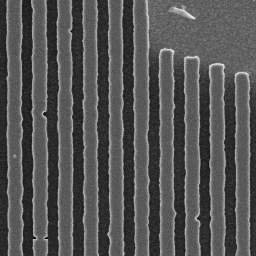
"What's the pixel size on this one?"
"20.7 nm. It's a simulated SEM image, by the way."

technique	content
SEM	parallel lines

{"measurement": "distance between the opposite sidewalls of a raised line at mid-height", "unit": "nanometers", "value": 303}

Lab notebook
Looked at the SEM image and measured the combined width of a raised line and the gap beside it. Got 524 nanometres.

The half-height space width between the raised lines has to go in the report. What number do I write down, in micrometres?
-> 0.233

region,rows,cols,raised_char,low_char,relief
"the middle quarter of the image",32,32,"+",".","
++...+++...++++..++++...+++...++
++...+++...+++...++++...+++...++
++...+++...++++..++++...+++...++
++...+++...++++..++++...+++...++
++...+++...++++..++++...+++...++
++...+++...++++..++++...+++...++
++...+++...++++..++++...+++...++
++...+++...++++..++++...+++...++
++...+++...++++...+++...+++...++
++...+++...++++...+++...+++...++
++...+++...++++...+++...++++..++
++...+++...++++...+++...+++...++
++...+++...+++....+++...+++...++
++...+++...+++....+++...+++...++
++...+++...++++...+++...+++...++
++...+++...++++...+++...+++....+
++...+++...++++...+++...+++....+
++...+++...++++...+++...+++...++
++...+++...++++...+++...+++...++
++...+++...+++....+++...+++...++
++...+++...++++...+++...+++...++
++...+++...++++...+++...+++...++
++...+++...++++...+++...+++...++
++...+++...++++...+++...+++...++
++...+++...++++...+++...+++...++
++...+++...++++...+++...+++...++
++...+++...++++...+++...+++...++
++...+++...++++...+++...++++...+
++...+++...++++...+++...+++...++
++...+++...++++...+++...+++...++
++...+++...++++...+++...+++...++
++...+++...++++...+++...+++...++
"